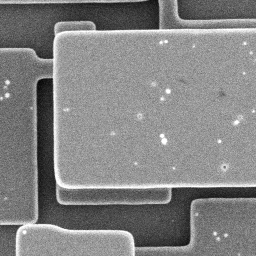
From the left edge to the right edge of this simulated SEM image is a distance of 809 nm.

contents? wiring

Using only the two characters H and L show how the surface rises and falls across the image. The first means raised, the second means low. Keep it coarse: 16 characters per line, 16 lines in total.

LLLLLLLLLLLLLLLL
LLLLLLLLLLLLLLLL
LLLHHHHHHHHHHHHH
LLLHHHHHHHHHHHHH
LLLHHHHHHHHHHHHH
LLLHHHHHHHHHHHHH
LLLHHHHHHHHHHHHH
LLLHHHHHHHHHHHHH
LLLHHHHHHHHHHHHH
LLLHHHHHHHHHHHHH
LLLHHHHHHHHHHHHH
LLLLHHHHHHHHHHHH
LLLLLLLLLLLLLLLL
LLLLLLLLLLLLLLLL
LHHHHHHHLLLLLLLL
LHHHHHHHLLLLLLLL